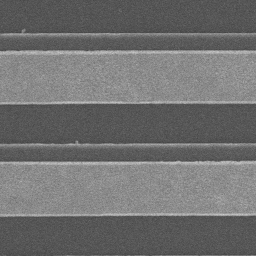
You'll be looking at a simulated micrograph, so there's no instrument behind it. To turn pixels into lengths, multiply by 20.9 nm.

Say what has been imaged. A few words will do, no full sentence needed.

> lines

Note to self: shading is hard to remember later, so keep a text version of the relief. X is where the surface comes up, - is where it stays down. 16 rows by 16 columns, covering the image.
----------------
----------------
----------------
XXXXXXXXXXXXXXXX
XXXXXXXXXXXXXXXX
XXXXXXXXXXXXXXXX
----------------
----------------
----------------
----------------
XXXXXXXXXXXXXXXX
XXXXXXXXXXXXXXXX
XXXXXXXXXXXXXXXX
----------------
----------------
----------------